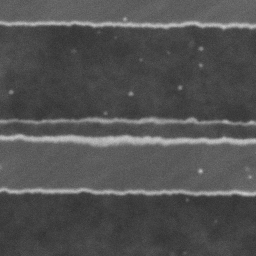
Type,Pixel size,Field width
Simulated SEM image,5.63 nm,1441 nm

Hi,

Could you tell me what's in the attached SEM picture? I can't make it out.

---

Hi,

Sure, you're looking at lines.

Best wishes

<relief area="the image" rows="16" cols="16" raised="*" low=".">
****************
****************
................
................
................
................
................
................
**..*..*........
****************
****************
****************
................
................
................
................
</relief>